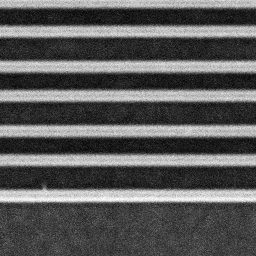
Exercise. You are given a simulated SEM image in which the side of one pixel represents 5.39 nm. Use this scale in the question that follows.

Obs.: parallel lines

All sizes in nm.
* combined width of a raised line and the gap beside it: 177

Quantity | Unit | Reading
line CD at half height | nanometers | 45.8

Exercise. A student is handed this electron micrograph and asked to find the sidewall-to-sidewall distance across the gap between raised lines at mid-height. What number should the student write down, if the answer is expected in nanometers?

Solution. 118